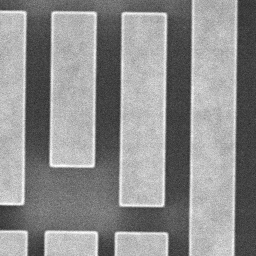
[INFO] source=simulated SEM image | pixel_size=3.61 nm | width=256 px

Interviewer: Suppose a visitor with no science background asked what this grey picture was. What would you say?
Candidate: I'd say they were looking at groups of lines, slits or small figures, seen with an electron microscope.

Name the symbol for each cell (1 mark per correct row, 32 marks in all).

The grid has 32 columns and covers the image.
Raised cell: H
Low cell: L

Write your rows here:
LLLLLLLLLLLLLLLLLLLLLLLLHHHHHHLL
HHHLLLLLLLLLLLLLLLLLLLLLHHHHHHLL
HHHLLLHHHHHHLLLHHHHHHLLLHHHHHHLL
HHHLLLHHHHHHLLLHHHHHHLLLHHHHHHLL
HHHLLLHHHHHHLLLHHHHHHLLLHHHHHHLL
HHHLLLHHHHHHLLLHHHHHHLLLHHHHHHLL
HHHLLLHHHHHHLLLHHHHHHLLLHHHHHHLL
HHHLLLHHHHHHLLLHHHHHHLLLHHHHHHLL
HHHLLLHHHHHHLLLHHHHHHLLLHHHHHHLL
HHHLLLHHHHHHLLLHHHHHHLLLHHHHHHLL
HHHLLLHHHHHHLLLHHHHHHLLLHHHHHHLL
HHHLLLHHHHHHLLLHHHHHHLLLHHHHHHLL
HHHLLLHHHHHHLLLHHHHHHLLLHHHHHHLL
HHHLLLHHHHHHLLLHHHHHHLLLHHHHHLLL
HHHLLLHHHHHHLLLHHHHHHLLLHHHHHLLL
HHHLLLHHHHHHLLLHHHHHHLLLHHHHHLLL
HHHLLLHHHHHHLLLHHHHHHLLLHHHHHLLL
HHHLLLHHHHHHLLLHHHHHHLLLHHHHHLLL
HHHLLLHHHHHHLLLHHHHHHLLLHHHHHLLL
HHHLLLHHHHHHLLLHHHHHHLLLHHHHHLLL
HHHLLLHHHHHHLLLHHHHHHLLLHHHHHLLL
HHHLLLLLLLLLLLLHHHHHHLLLHHHHHLLL
HHHLLLLLLLLLLLLHHHHHHLLLHHHHHLLL
HHHLLLLLLLLLLLLHHHHHHLLLHHHHHLLL
HHHLLLLLLLLLLLLHHHHHLLLLHHHHHLLL
HHHLLLLLLLLLLLLHHHHHLLLLHHHHHLLL
LLLLLLLLLLLLLLLLLLLLLLLLHHHHHLLL
LLLLLLLLLLLLLLLLLLLLLLLLHHHHHLLL
LLLLLLLLLLLLLLLLLLLLLLLLHHHHHLLL
HHHLLLHHHHHHLLHHHHHHHLLLHHHHHLLL
HHHLLLHHHHHHLLHHHHHHHLLLHHHHHLLL
HHHLLLHHHHHHLLHHHHHHHLLLHHHHHLLL